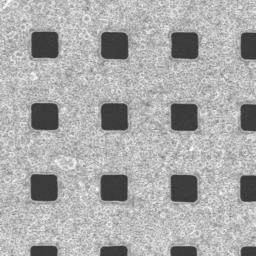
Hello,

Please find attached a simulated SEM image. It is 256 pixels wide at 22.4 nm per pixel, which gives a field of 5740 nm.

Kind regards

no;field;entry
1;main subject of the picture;a regular array of holes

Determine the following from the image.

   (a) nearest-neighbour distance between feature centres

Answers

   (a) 1570 nanometers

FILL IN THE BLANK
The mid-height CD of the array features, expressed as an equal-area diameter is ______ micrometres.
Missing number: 0.673